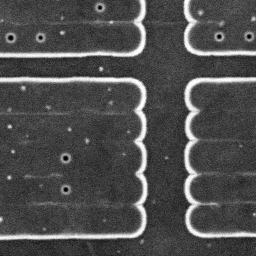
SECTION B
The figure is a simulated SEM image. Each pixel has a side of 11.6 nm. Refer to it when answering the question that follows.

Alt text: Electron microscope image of wiring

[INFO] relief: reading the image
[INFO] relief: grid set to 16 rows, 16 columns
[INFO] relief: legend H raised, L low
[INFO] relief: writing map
HHHHHHHHHLLLHHHH
HHHHHHHHHLLLHHHH
HHHHHHHHHLLLHHHH
LLLLLLLLLLLLLLLL
LLLLLLLLLLLLLLLL
HHHHHHHHHLLLHHHH
HHHHHHHHHLLLHHHH
HHHHHHHHHLLLHHHH
HHHHHHHHHLLLHHHH
HHHHHHHHHLLLHHHH
HHHHHHHHHLLLHHHH
HHHHHHHHHLLLHHHH
HHHHHHHHHLLLHHHH
HHHHHHHHHLLLHHHH
HHHHHHHHHLLLHHHH
LLLLLLLLLLLLLLLL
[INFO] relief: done